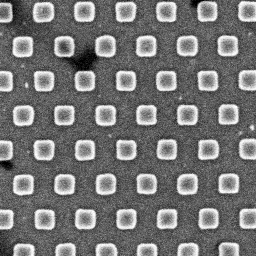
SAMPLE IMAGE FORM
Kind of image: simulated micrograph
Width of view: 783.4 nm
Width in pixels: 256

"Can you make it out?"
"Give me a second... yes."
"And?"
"a regular array of raised bodies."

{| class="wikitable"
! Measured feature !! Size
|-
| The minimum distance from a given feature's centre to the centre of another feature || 122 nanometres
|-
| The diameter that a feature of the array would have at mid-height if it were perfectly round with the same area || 65.5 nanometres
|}